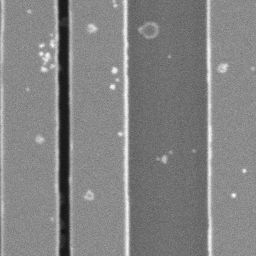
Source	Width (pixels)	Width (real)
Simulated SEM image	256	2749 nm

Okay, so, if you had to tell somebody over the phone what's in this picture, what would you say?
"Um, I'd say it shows lines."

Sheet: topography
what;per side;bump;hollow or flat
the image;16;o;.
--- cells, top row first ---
oooooooo.....ooo
oooooooo.....ooo
oooooooo.....ooo
oooooooo.....ooo
oooooooo.....ooo
oooooooo.....ooo
oooooooo.....ooo
oooooooo.....ooo
oooooooo.....ooo
oooooooo.....ooo
oooooooo.....ooo
oooooooo.....ooo
oooooooo.....ooo
oooooooo.....ooo
oooooooo.....ooo
oooooooo.....ooo